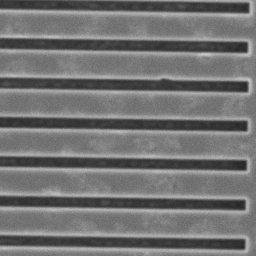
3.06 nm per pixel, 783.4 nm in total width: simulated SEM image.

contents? parallel lines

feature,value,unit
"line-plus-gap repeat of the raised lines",121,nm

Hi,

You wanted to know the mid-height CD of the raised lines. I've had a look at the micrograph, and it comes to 86.1 nanometers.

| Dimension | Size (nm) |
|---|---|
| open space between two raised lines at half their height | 35.2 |